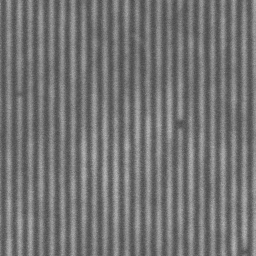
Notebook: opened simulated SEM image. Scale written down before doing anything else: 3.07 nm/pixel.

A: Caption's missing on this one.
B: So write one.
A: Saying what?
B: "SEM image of parallel lines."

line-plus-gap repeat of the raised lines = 32.8 nm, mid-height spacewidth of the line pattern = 21.5 nm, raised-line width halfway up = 10.7 nanometres